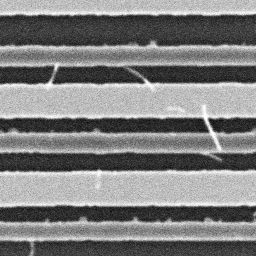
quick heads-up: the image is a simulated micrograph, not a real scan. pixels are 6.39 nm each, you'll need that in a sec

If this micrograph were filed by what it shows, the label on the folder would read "lines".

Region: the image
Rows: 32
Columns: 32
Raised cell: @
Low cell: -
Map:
@@@@@@@@@@@@@@@@@@@@@@@@@@@@@@@@
@@@@@@@@@@@@@@@@@@@@@@@@@@@@@@@@
--------------------------------
--------------------------------
--------------------------------
--------------------------------
@@@@@@@@@@@@@@@@@@@@@@@@@@@@@@@@
@@@@@@@@@@@@@@@@@@@@@@@@@@@@@@@@
--------------------------------
--------------------------------
------@-----------@@-------@@@--
@@@@@@@@@@@@@@@@@@@@@@@@@@@@@@@@
@@@@@@@@@@@@@@@@@@@@@@@@@@@@@@@@
@@@@@@@@@@@@@@@@@@@@@@@@@@@@@@@@
@@@@@@@@@@@@@@@@@@@@@@@@@@@@@@@@
--------------------------------
--------------------------@-----
@@@@@@@@@@@@@@@@@@@@@@@@@@@@@@@@
@@@@@@@@@@@@@@@@@@@@@@@@@@@@@@@@
--------------------------------
--------------------------------
@-@@@----@@@@@@@@@@@@@@@@@@@@@@@
@@@@@@@@@@@@@@@@@@@@@@@@@@@@@@@@
@@@@@@@@@@@@@@@@@@@@@@@@@@@@@@@@
@@@@@@@@@@@@@@@@@@@@@@@@@@@@@@@@
@@@@@@@@@@@@@@@@@@@@@@@@@@@@@@@@
--------------------------------
--------------------------------
@@@@@@@@@@@@@@@@@@@@@@@@@@@@@@@@
@@@@@@@@@@@@@@@@@@@@@@@@@@@@@@@@
--------------------------------
--------------------------------